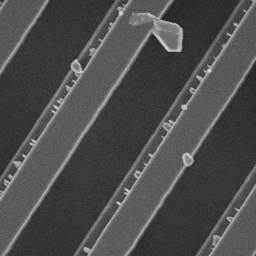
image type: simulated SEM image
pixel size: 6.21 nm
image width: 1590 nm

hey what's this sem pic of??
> lines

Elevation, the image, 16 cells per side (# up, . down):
###....###.....#
##....#####...##
#.....###.#...##
#....####....###
....####....###.
....###.....###.
...####....###..
..####....####..
..###.....###...
.####....###....
####....####....
###.....###....#
###....###.....#
##....####....##
#.....###....###
#....###.....###